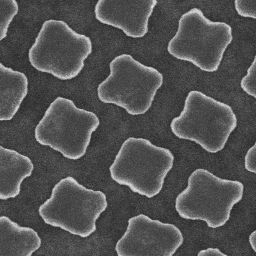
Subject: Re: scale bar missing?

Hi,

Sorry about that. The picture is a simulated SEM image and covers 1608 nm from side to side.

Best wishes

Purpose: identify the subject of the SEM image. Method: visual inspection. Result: a regular array of raised bodies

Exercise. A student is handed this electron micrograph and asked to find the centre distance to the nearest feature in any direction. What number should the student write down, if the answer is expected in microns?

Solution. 0.483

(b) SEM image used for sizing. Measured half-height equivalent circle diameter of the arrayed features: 0.353 µm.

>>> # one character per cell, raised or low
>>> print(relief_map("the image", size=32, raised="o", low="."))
oo..........ooooooo..........ooo
oo..........ooooooo.....o.....oo
o...........oooooo.....ooo......
o....oooo......ooo....ooooooo...
.....ooooo......oo....ooooooo...
....ooooooo..........oooooooo...
....ooooooo..........ooooooo....
....ooooooo...ooo......ooooo....
o....ooooo....ooooo......oo....o
ooo....oo.....oooooo...........o
ooo..........ooooooo..........oo
ooo.........ooooooo.....o......o
ooo....oo....oooooo....oooo.....
oo....oooo.....oooo....oooooo...
oo....oooooo..........ooooooo...
.....ooooooo..........ooooooo...
....oooooooo..........ooooooo...
.....oooooo.....oo......oooo....
o......oooo....ooooo......oo...o
ooo.....oo.....oooooo..........o
oooo..........ooooooo..........o
oooo..........ooooooo...oo......
ooo.....o.....oooooo....oooo....
oo.....oooo......ooo...ooooooo..
oo....ooooooo.........oooooooo..
......ooooooo.........ooooooo...
.....oooooooo.........ooooooo...
o.....oooooo....ooo......ooo....
ooo.....oooo....oooooo..........
ooooo..........oooooooo........o
ooooo..........ooooooo.........o
oooo...........ooooooo...ooo....